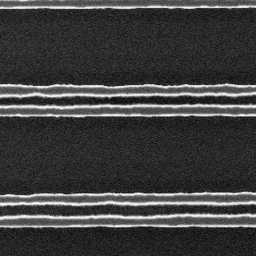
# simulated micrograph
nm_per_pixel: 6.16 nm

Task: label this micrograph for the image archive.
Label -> lines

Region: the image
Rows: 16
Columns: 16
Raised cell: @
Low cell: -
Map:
@---@@-@--------
----------------
----------------
----------------
----------------
@@@@@@@@@@@@@@@@
@@@@@@@@@@@@@@@@
----------------
----------------
----------------
----------------
----------------
@@@@@@@@@@@@@@@@
@@@@@@@@@@@@@@@@
----------------
----------------